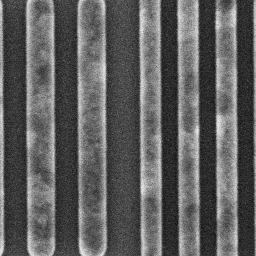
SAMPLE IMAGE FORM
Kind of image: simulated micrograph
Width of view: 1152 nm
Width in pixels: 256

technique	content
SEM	groups of lines, slits or small figures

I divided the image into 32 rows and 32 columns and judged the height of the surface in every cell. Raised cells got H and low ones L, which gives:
LLLHHHHLLLHHHLLLLLHHLLHHHLLHHLLL
LLLHHHHLLLHHHLLLLLHHLLHHHLLHHLLL
LLLHHHHLLLHHHLLLLLHHLLHHHLLHHLLL
LLLHHHHLLLHHHLLLLLHHLLHHHLLHHLLL
LLLHHHHLLLHHHLLLLLHHLLHHHLLHHLLL
LLLHHHHLLLHHHLLLLLHHLLHHHLLHHLLL
LLLHHHHLLLHHHLLLLLHHLLHHHLLHHLLL
LLLHHHHLLLHHHLLLLLHHLLHHHLLHHLLL
LLLHHHHLLLHHHLLLLLHHLLHHHLLHHLLL
LLLHHHHLLLHHHLLLLLHHLLHHHLLHHLLL
LLLHHHHLLLHHHLLLLLHHLLHHHLLHHLLL
LLLLHHHLLLHHHLLLLLHHLLHHHLLHHLLL
LLLHHHHLLLHHHLLLLLHHLLHHHLLHHLLL
LLLHHHHLLLHHHLLLLLHHLLHHHLLHHLLL
LLLHHHHLLLHHHLLLLLHHLLHHHLLHHLLL
LLLHHHHLLLHHHLLLLLHHLLHHHLLHHLLL
LLLHHHHLLLHHHLLLLLHHLLHHHLLHHHLL
LLLLHHHLLLHHHLLLLLHHLLHHHLLHHHLL
LLLLHHHLLLHHHLLLLLHHLLHHHLLHHHLL
LLLLHHHLLLHHHLLLLLHHLLHHHLLHHHLL
LLLLHHHLLLHHHLLLLLHHLLHHHLLHHHLL
LLLLHHHLLLHHHLLLLLHHLLHHHLLHHHLL
LLLLHHHLLLHHHLLLLLHHLLHHHLLHHHLL
LLLLHHHLLLHHHLLLLLHHLLHHHLLHHHLL
LLLLHHHLLLHHHLLLLLHHLLHHHLLHHHLL
LLLLHHHLLLHHHLLLLLHHLLHHHLLHHHLL
LLLLHHHLLLHHHLLLLLHHLLHHHLLHHHLL
LLLLHHHLLLHHHLLLLLHHLLHHHLLHHHLL
LLLLHHHLLLHHHLLLLLHHLLHHHLLHHHLL
LLLLHHHLLLHHHLLLLLHHLLHHHLLHHHLL
LLLLHHHLLLHHHLLLLLHHLLHHHLLHHHLL
LLLLHHHLLLHHHLLLLLHHLLHHHLLHHHLL